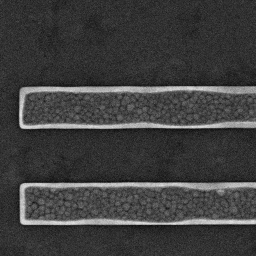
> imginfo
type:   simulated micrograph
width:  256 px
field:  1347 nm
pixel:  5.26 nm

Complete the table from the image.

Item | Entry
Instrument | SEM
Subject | wiring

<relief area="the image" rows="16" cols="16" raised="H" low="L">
LLLLLLLLLLLLLLLL
LLLLLLLLLLLLLLLL
LLLLLLLLLLLLLLLL
LLLLLLLLLLLLLLLL
LLLLLLLLLLLLLLLL
LLLLLLLLLLLLLLLL
LHHHHHHHHHHHHHHH
LHHHHHHHHHHHHHHH
LLLLLLLLLLLLLLLL
LLLLLLLLLLLLLLLL
LLLLLLLLLLLLLLLL
LLLLLLLLLLLLLLLL
LHHHHHHHHHHHHHHH
LHHHHHHHHHHHHHHH
LLLLLLLLLLLLLLLL
LLLLLLLLLLLLLLLL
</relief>